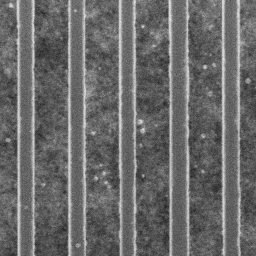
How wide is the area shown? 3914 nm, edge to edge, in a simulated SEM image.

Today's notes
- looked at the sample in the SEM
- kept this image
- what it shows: lines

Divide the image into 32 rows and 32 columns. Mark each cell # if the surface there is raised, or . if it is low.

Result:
..##.....##....##....##.....##..
..##.....##....##....##.....##..
..##.....##....##....##.....##..
..##.....##....##....##.....##..
..##.....##....##....##.....##..
..##.....##....##....##.....##..
..##.....##....##....##.....##..
..##.....##....##....##.....##..
..##.....##....##....##.....##..
..##.....##....##....###....##..
..##.....##....##....##.....##..
..##.....##....##....###....##..
..##.....##....##....##.....##..
..##.....##....##....##.....##..
..##.....##....##....##.....##..
..##.....##....##....##.....##..
..##.....##....##....###....##..
..##.....##....##....##.....##..
..##.....##....##....##.....##..
..##.....##....##....###....##..
..##.....##....##....###....##..
..##.....##....##....###....##..
..##.....##....##....###....##..
..##.....##....##....###....##..
..##.....##....##....###....##..
..##.....##....##....###....##..
..##.....##....##....###....##..
..##.....##....##....###....##..
..##.....##....##....###....##..
..##.....##....##....###....##..
..##.....##....##....###....##..
..##.....##....##....###....##..